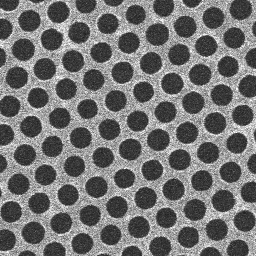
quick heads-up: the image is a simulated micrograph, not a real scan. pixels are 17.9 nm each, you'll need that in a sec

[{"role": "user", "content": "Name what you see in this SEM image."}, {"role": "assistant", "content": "a regular array of holes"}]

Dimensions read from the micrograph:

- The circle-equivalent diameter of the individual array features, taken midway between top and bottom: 395 nanometers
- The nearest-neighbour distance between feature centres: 0.511 microns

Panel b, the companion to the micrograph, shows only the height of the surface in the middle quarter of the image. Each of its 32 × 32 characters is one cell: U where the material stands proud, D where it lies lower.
DDDDDUUUUUUUDDDDDUUDDDDDUUUUUUUU
DDDDUUDDUUUUDDDDDUUDDDDDUUUUUUUD
UUUUUDDDDDUUDDDDDUUUUDUUUDDDUUUD
DUUUUDDDDDUUDDDDDUUUUUUUUDDDDUUD
DDDUUDDDDDUUUDDDUUUDDUUUDDDDDDUU
DDDUUDDDDDUUUUUUUUDDDDUUDDDDDDUU
DDDUUUDDDUUUDDUUUDDDDDUUUDDDDUUU
DDDUUUUUUUUDDDDUUDDDDDUUUUDDUUUD
DDUUUUUUUUDDDDDDUUDDDDUUUUUUUUDD
UUUUDDDDUUDDDDDDUUUDUUUUDDDUUDDD
UUUDDDDDUUDDDDDUUUUUUUUDDDDDUUDD
DUUDDDDDDUUDDDUUUUUUUUUDDDDDUUDD
DUUUDDDDUUUUUUUUDDDDDUUDDDDDUUUU
DDUUDDDUUUUUUUUUDDDDDUUDDDDDUUUU
DUUUUUUUUDDDDUUUDDDDDUUUDDDUUUDD
DUUUUUUUUDDDDDUUDDDDDUUUUUUUUDDD
UUDDDDUUUDDDDDUUUDDDUUDDDUUUDDDD
UDDDDDDUUDDDDDUUUUUUUDDDDDUUDDDD
UDDDDDDUUUDDDUUUUUUUUDDDDDUUDDDD
UUDDDDDUUUUUUUDDDDDUUDDDDDUUUDDD
UUDDDDUUUUUUUUDDDDDUUDDDDDUUUUUU
UUUUUUUUDDDDUUDDDDDUUUDDDUUUDDUU
UUUUUUUDDDDDUUDDDDDUUUUUUUUDDDDU
UDDDUUUDDDDDDUUDDDUUUUUUUUDDDDDD
DDDDDUUDDDDDUUUUUUUUDDDDUUDDDDDD
DDDDDUUUDDDUUUUUUUUDDDDDUUDDDDDU
DDDDDUUUUUUUUUDDDUUDDDDDDUUUDDUU
UDDDUUUUUUUUUDDDDDUUDDDDDUUUUUUU
UUUUUUUDDDUUDDDDDDUUDDDDUUUUUUUU
UUUUUUDDDDDUUDDDDDUUUUUUUDDDDUUU
DDUUUDDDDDDUUDDDDUUUUUUUUDDDDDUU
DDDUUDDDDDDUUUUUUUDDDDUUUDDDDDUU